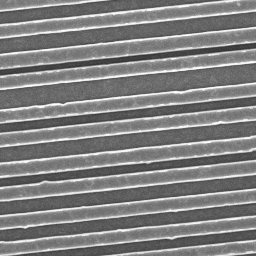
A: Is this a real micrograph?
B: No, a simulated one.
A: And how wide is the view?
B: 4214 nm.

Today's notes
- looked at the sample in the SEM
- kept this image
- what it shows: parallel lines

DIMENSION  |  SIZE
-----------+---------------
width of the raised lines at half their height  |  13.5 pixels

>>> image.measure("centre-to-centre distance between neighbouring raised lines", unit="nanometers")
444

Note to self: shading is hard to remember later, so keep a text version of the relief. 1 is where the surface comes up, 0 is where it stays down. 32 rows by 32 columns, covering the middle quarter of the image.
00000000011111111111111111111111
11111111111111111111111111111100
11111111111111111100000000000000
11111111111000000000000000000000
11000000000000000000000000000000
00000000000000000000000000000000
00000000000000000000000000000000
00000000000000000000000111111111
00000000000011111111111111111111
00001111111111111111111111111111
11111111111111111111111100000000
11111111111111000000000000000000
11111000000000000000000000000001
00000000000000000000011111111111
00000000000011111111111111111111
00111111111111111111111111111111
11111111111111111111111000000000
11111111111111000000000000000000
11111000000000000000000000000000
00000000000000000000000000000000
00000000000000000000000000111111
00000000000000001111111111111111
00000001111111111111111111111111
11111111111111111111111111111100
11111111111111111111110000000000
11111111111000000000000000000000
11000000000000000000000000111111
00000000000000001111111111111111
00000001111111111111111111111111
11111111111111111111111111110000
11111111111111111111000000000000
11111111111000000000000000000000